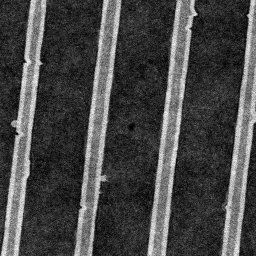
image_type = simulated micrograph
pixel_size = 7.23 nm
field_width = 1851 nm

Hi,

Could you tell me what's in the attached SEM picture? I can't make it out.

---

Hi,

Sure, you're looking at one or a few lines or trenches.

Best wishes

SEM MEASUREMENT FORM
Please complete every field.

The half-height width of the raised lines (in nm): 97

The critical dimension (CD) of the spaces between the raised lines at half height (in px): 59.2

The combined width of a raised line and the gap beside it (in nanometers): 527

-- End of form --